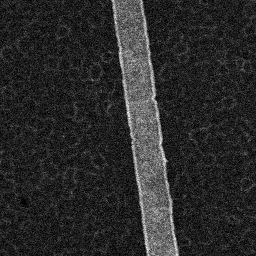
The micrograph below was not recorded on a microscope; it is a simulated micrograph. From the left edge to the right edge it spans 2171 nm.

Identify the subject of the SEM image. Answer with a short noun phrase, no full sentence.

one or a few lines or trenches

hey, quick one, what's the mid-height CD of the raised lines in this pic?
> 242 nm